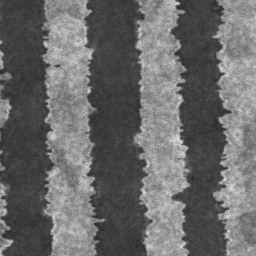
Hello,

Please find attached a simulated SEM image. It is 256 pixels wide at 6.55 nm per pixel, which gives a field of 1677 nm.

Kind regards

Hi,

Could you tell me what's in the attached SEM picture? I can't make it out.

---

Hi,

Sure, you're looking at one or a few lines or trenches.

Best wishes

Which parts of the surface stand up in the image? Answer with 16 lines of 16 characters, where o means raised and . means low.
...oo....oo...oo
...oo....oo...oo
...oo....oo...oo
...ooo...oo...oo
...oo....oo...oo
...ooo...oo...oo
...ooo...oo...oo
...ooo...oo...oo
...ooo...oo...oo
...ooo...oo...oo
...oo....ooo..oo
...ooo...ooo..oo
...ooo...oo...oo
...ooo...oo...oo
...ooo...oo...oo
...ooo...ooo..oo